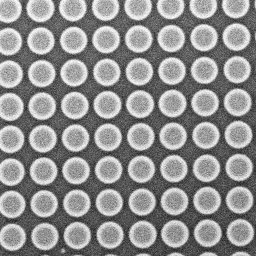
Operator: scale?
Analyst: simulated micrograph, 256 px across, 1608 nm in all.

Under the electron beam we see an array of small figures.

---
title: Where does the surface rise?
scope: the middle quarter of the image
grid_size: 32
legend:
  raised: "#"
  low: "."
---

#####...######..######..######..
######..######..######..######..
######..######..######..######..
#####...######..######..######..
#####....####....####....####...
................................
................................
.###.....####....####....####...
#####...######..######..######..
######..######..######..######..
######..######..######..######..
######..######..######..######..
#####...#####....####....####...
..##......##....................
................................
..##.....####....####....####...
#####...######..######..######..
######..######..######..######..
######..######..######..######..
######..######..######..######..
#####....####....####....####...
..##......##....................
................................
..##......###.....###.....###...
.####....#####...#####...#####..
######..######..######..#######.
######..######..#######.#######.
######..######..######..######..
######...#####...#####...#####..
.####.....##.......#............
................................
..........##......###.....###...